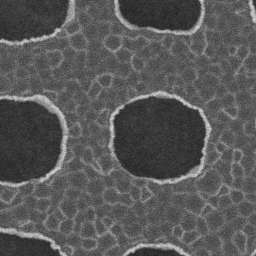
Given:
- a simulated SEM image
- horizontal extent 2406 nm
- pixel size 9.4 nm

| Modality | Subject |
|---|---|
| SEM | holes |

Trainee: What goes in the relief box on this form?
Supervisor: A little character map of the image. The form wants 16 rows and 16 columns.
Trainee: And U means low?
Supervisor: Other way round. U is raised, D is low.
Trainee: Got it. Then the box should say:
DDDDUUUDDDDDDUUU
DDDDUUUUDDDDUUUU
DDUUUUUUUUUUUUUU
UUUUUUUUUUUUUUUU
UUUUUUUUUUUUUUUU
UUUUUUUUUUUUUUUU
DDDUUUUUDDDUUUUU
DDDDUUUDDDDDDUUU
DDDDUUUDDDDDDUUU
DDDDUUUDDDDDDUUU
DDDUUUUUDDDDUUUU
UUUUUUUUUUUUUUUU
UUUUUUUUUUUUUUUU
UUUUUUUUUUUUUUUU
UUUUUUUUUUUUUUUU
DDDUUUUUUDUUUUUU